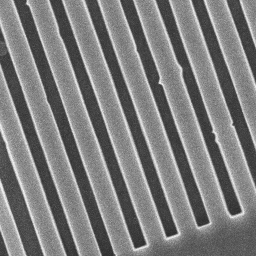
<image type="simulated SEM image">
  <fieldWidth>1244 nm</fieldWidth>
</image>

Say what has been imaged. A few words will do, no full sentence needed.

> parallel lines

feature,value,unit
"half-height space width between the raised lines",63.1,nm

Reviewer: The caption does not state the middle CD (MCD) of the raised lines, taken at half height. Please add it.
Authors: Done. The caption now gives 99.2 nm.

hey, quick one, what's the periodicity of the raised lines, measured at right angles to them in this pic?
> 163 nm